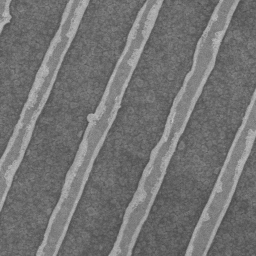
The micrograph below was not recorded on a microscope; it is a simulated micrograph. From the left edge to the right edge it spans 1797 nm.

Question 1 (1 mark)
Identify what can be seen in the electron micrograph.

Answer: one or a few lines or trenches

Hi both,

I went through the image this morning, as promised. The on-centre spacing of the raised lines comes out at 68.9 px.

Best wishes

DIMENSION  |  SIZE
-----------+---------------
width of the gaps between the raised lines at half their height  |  372 nanometers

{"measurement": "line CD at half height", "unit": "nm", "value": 112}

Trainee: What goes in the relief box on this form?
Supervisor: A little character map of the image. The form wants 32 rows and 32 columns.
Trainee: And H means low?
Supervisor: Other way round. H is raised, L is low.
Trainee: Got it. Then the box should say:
HLLLLLLLLHHLLLLLLLHHLLLLLLLHHHLL
HLLLLLLLHHLLLLLLLLHHLLLLLLLHHLLL
HLLLLLLLHHLLLLLLLHHLLLLLLLHHHLLL
LLLLLLLLHHLLLLLLLHHLLLLLLLHHLLLL
LLLLLLLHHLLLLLLLHHLLLLLLLHHHLLLL
LLLLLLLHHLLLLLLLHHLLLLLLLHHLLLLL
LLLLLLHHLLLLLLLLHHLLLLLLLHHLLLLL
LLLLLLHHLLLLLLLHHLLLLLLLHHHLLLLL
LLLLLHHLLLLLLLLHHLLLLLLLHHLLLLLL
LLLLLHHLLLLLLLHHLLLLLLLLHHLLLLLL
LLLLHHLLLLLLLLHHLLLLLLLHHLLLLLLL
LLLLHHLLLLLLLHHLLLLLLLLHHLLLLLLL
LLLLHHLLLLLLLHHLLLLLLLHHLLLLLLLL
LLLHHLLLLLLLHHHLLLLLLLHHLLLLLLLH
LLLHHLLLLLLHHHLLLLLLLHHHLLLLLLLH
LLHHLLLLLLLHHHLLLLLLLHHLLLLLLLHH
LLHHLLLLLLLHHLLLLLLLLHHLLLLLLLHH
LHHHLLLLLLHHHLLLLLLLHHLLLLLLLHHH
LHHLLLLLLLHHLLLLLLLLHHLLLLLLLHHL
HHHLLLLLLLHHLLLLLLLHHLLLLLLLLHHL
HHLLLLLLLHHLLLLLLLLHHLLLLLLLHHLL
HHLLLLLLLHHLLLLLLLHHHLLLLLLLHHLL
HLLLLLLLHHHLLLLLLLHHLLLLLLLHHHLL
HLLLLLLLHHLLLLLLLLHHLLLLLLLHHLLL
HLLLLLLLHHLLLLLLLHHLLLLLLLLHHLLL
LLLLLLLHHLLLLLLLLHHLLLLLLLHHLLLL
LLLLLLLHHLLLLLLLHHLLLLLLLHHHLLLL
LLLLLLHHHLLLLLLLHHLLLLLLLHHHLLLL
LLLLLLHHLLLLLLLHHLLLLLLLLHHLLLLL
LLLLLLHHLLLLLLLHHLLLLLLLHHHLLLLL
LLLLLHHLLLLLLLLHHLLLLLLLHHLLLLLL
LLLLLHHLLLLLLLHHLLLLLLLHHHLLLLLL